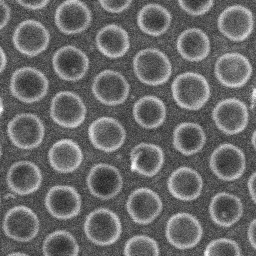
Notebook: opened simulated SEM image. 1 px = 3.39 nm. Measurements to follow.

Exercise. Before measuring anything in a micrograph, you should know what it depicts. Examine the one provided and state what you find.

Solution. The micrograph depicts a regular array of raised bodies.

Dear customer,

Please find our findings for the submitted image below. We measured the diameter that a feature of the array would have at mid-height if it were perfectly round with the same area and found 116 nanometers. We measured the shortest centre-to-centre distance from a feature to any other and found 157 nm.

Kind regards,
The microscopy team